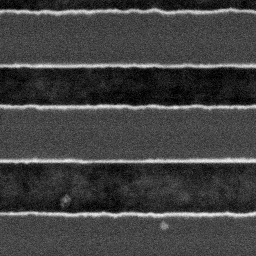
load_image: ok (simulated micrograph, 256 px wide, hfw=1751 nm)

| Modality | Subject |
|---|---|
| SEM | lines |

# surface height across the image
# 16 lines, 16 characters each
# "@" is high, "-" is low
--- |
----------------
@@@@@@@@@@@@@@@@
@@@@@@@@@@@@@@@@
@@@@@@@@@@@@@@@@
----------------
----------------
----------------
@@@@@@@@@@@@@@@@
@@@@@@@@@@@@@@@@
@@@@@@@@@@@@@@@@
----------------
----------------
----------------
@@@@@@@@@@@@@@@@
@@@@@@@@@@@@@@@@
@@@@@@@@@@@@@@@@